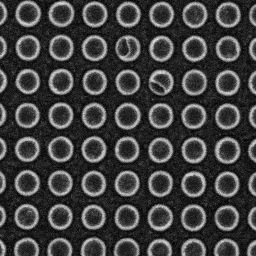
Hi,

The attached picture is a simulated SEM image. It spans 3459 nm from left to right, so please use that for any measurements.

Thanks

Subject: a regular array of raised bodies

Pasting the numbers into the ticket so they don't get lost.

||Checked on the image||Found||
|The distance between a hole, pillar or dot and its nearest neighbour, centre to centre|448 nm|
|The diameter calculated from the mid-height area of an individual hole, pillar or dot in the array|314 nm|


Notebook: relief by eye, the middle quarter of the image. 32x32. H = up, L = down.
LLLLLLLLLLLLLLLLLLLLLLLLLLLLLLLL
LLLLLLLLLLLLLLLLLLLLLLLLLLLLLLLL
HHLLLLHHHHLLLLHHHHLLLLHHHHLLLLLH
HHLLLHHHHHLLLHHHHHLLLLHHHHHLLLHH
HHLLLHHHHHLLLHHHHHHLLLHHHHHLLLHH
HHLLLHHHHHLLLHHHHHHLLLLLHHHLLLHH
HLLLLLHHHHLLLLHHHHLLLLLLLHHLLLHH
LLLLLLLLLLLLLLLLLLLLLLLLLLLLLLLH
LLLLLLLLLLLLLLLLLLLLLLLLLLLLLLLL
LLLLLLLLLLLLLLLLLLLLLLLLLLLLLLLL
HLLLLLHHHLLLLLHHHLLLLLLHHHLLLLLH
HHLLLHHHHHLLLHHHHHLLLLHHHHHLLLHH
HHLLLHHHHHLLLHHHHHHLLLHHHHHLLLHH
HHLLLHHHHHLLLHHHHHHLLHHHHHHLLLHH
HHLLLHHHHHLLLHHHHHLLLLHHHHHLLLHH
HLLLLLHHHLLLLLHHHLLLLLLHHHLLLLLH
LLLLLLLLLLLLLLLLLLLLLLLLLLLLLLLL
LLLLLLLLLLLLLLLLLLLLLLLLLLLLLLLL
LLLLLLLHLLLLLLLHHLLLLLLLLLLLLLLL
HHLLLHHHHHLLLHHHHHLLLLHHHHLLLLHH
HHLLLHHHHHLLLHHHHHLLLLHHHHHLLLHH
HHLLLHHHHHLLLHHHHHLLLLHHHHHLLLHH
HHLLLHHHHHLLLHHHHHLLLLHHHHHLLLHH
HLLLLHHHHHLLLLHHHHLLLLHHHHLLLLHH
LLLLLLLLLLLLLLLLLLLLLLLLLLLLLLLL
LLLLLLLLLLLLLLLLLLLLLLLLLLLLLLLL
LLLLLLLLLLLLLLLLLLLLLLLLLLLLLLLL
HLLLLLHHHLLLLLHHHHLLLLHHHHLLLLLH
HLLLLHHHHHLLLHHHHHLLLHHHHHHLLLHH
HHLLLHHHHHLLLHHHHHHLLHHHHHHLLLHH
HHLLLHHHHHLLLHHHHHHLLHHHHHHLLLHH
HLLLLHHHHHLLLHHHHHLLLLHHHHLLLLHH